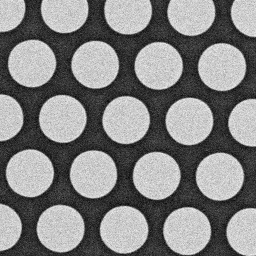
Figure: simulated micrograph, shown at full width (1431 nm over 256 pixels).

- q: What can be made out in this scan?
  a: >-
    an array of small figures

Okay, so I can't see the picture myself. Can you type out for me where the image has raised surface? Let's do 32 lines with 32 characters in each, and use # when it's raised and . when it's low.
###..######..######..######..###
###..######..######..######..###
###...#####..######..######..###
##....####....####....####....##
...............................#
..####.....##......##......#....
.######..#####...#####....####..
.######..######..######..######.
.######..######..######..######.
.#####...#####...######..#####..
...##.....####....####....####..
................................
##....####....###......##......#
###..#####...#####...#####...###
###..######..######..######..###
###..######..######..######..###
##...#####...#####...#####...###
#......##.....###.....###.....##
................................
..####....####....###.....###...
.#####...#####...#####...#####..
.######..######..#####...#####..
.######..######..#####...#####..
.#####...#####...#####...#####..
...##......##.....###.....###...
................................
##....####....###.....###.....##
###..#####...#####...#####...###
###..#####...#####..######..####
##...#####...#####...#####..####
##...#####...#####...#####...###
...............#......###.....##